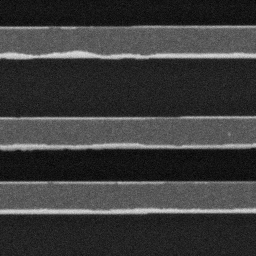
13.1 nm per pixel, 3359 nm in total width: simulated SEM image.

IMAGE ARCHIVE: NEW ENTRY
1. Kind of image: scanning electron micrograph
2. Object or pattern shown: lines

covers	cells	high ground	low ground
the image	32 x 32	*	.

................................
................................
................................
********************************
********************************
********************************
********************************
................................
................................
................................
................................
................................
................................
................................
................................
********************************
********************************
********************************
*****....*......................
................................
................................
................................
................................
********************************
********************************
********************************
*****.********..................
................................
................................
................................
................................
................................